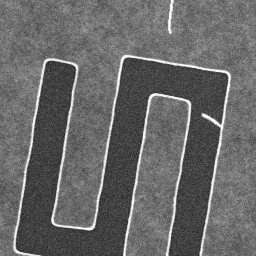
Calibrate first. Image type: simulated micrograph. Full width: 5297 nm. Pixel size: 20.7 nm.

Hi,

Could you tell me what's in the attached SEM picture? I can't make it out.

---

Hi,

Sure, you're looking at groups of lines, slits or small figures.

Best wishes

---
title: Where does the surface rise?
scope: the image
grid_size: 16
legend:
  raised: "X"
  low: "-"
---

XXXXXXXXXXXXXXXX
XXXXXXXXXXXXXXXX
XXXXXXXXXXXXXXXX
XXXXXXXXXXXXXXXX
XXX--XX-------XX
XX---XX-------XX
XX---XX--XXX--XX
XX--XXX--XXX--XX
XX--XXX--XXX--XX
XX--XXX--XX---XX
XX--XXX--XX--XXX
XX--XX--XXX--XXX
X---XX--XXX--XXX
X--XXX--XXX--XXX
X-------XXX--XXX
X-------XXX--XXX